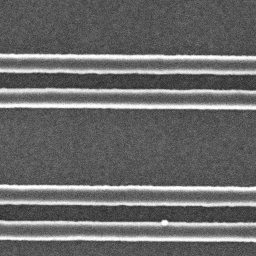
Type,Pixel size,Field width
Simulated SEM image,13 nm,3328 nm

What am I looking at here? lines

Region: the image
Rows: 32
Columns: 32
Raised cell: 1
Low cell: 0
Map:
00000000000000000000000000000000
00000000000000000000000000000000
00000000000000000000000000000000
00000000000000000000000000000000
00000000000000000000000000000000
00000000000000000000000000000000
00000000000000000000000000000000
11111111111111111111111111111111
11111111111111111111111111111111
00000000000000000000000000000000
00000000000000000000000000000000
11111111111111111111111111111111
11111111111111111111111111111111
00000000000000000000000000000000
00000000000000000000000000000000
00000000000000000000000000000000
00000000000000000000000000000000
00000000000000000000000000000000
00000000000000000000000000000000
00000000000000000000000000000000
00000000000000000000000000000000
00000000000000000000000000000000
00000000000000000000000000000000
11111111111111111111111111100000
11111111111111111111111111111111
00000000000111111111111111111111
00000000000000000000000000000000
00000000000000000000000000000000
11111111111111111111111111111111
11111111111111111111111111111111
00000000000000000000000000000000
00000000000000000000000000000000